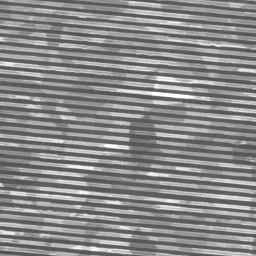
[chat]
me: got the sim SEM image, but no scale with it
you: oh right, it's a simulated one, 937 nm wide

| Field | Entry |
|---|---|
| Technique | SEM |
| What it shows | parallel lines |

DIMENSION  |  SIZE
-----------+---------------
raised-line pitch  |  29.3 nm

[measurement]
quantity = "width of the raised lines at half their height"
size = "11.8 nanometers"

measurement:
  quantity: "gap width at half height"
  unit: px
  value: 4.73